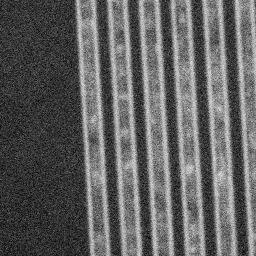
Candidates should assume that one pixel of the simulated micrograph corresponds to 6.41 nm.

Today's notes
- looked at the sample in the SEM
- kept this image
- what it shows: parallel lines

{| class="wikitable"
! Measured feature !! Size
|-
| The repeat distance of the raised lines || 203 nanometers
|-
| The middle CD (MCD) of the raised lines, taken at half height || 0.105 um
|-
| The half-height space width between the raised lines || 99.1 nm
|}